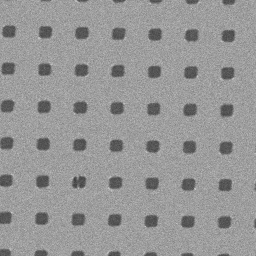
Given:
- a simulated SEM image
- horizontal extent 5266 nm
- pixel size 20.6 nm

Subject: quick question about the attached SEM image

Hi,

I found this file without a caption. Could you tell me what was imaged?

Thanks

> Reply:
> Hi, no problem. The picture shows a regular array of holes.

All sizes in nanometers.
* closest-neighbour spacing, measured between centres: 748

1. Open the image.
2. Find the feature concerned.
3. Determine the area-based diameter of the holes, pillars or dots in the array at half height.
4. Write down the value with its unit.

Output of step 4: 284 nm